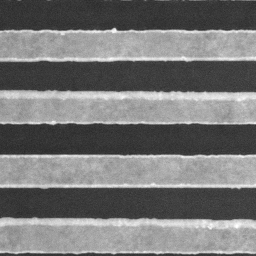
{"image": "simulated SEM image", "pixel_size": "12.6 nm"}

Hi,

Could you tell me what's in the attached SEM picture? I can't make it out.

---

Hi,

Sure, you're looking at lines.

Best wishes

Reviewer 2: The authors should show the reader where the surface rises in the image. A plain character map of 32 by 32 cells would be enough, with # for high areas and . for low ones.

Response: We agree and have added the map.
................................
................................
................................
................................
################################
################################
################################
##############################..
................................
................................
................................
#####.#.........................
################################
################################
################################
......#.........................
................................
................................
................................
###############.#######.########
################################
################################
################################
................................
................................
................................
................................
################.###............
################################
################################
################################
################################